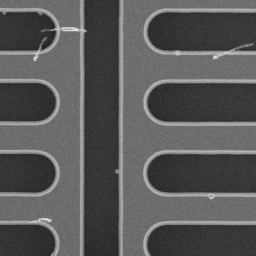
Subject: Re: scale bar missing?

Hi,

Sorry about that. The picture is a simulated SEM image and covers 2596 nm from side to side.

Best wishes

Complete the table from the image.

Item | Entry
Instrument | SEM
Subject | groups of lines, slits or small figures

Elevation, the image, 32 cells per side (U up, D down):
UUUUUUUUUUDDDDDUUUUUUUUUUUUUUUUU
DDDDDUUUUUDDDDDUUUUUDDDDDDDDDDDD
DDDDDDDUUUDDDDDUUUUDDDDDDDDDDDDD
DDDDDDDUUUDDDDDUUUDDDDDDDDDDDDDD
DDDDDDDUUUDDDDDUUUDDDDDDDDDDDDDD
DDDDDDDUUUDDDDDUUUUDDDDDDDDDDDDD
DDDDUUUUUUDDDDDUUUUUUDUDDDDDUDDD
UUUUUUUUUUDDDDDUUUUUUUUUUUUUUUUU
UUUUUUUUUUDDDDDUUUUUUUUUUUUUUUUU
UUUUUUUUUUDDDDDUUUUUUUUUUUUUUUUU
DDDDDDUUUUDDDDDUUUUUDDDDDDDDDDDD
DDDDDDDUUUDDDDDUUUUDDDDDDDDDDDDD
DDDDDDDUUUDDDDDUUUDDDDDDDDDDDDDD
DDDDDDDUUUDDDDDUUUDDDDDDDDDDDDDD
DDDDDDUUUUDDDDDUUUUDDDDDDDDDDDDD
UUUUUUUUUUDDDDDUUUUUUUUUUUUUUUUU
UUUUUUUUUUDDDDDUUUUUUUUUUUUUUUUU
UUUUUUUUUUDDDDDUUUUUUUUUUUUUUUUU
UUUUUUUUUUDDDDDUUUUUUUUUUUUUUUUU
DDDDDDUUUUDDDDDUUUUDDDDDDDDDDDDD
DDDDDDDUUUDDDDDUUUDDDDDDDDDDDDDD
DDDDDDDUUUDDDDDUUUDDDDDDDDDDDDDD
DDDDDDDUUUDDDDDUUUDDDDDDDDDDDDDD
DDDDDDUUUUDDDDDUUUUDDDDDDDDDDDDD
UUUUUUUUUUDDDDDUUUUUUUUUUUUUUUUU
UUUUUUUUUUDDDDDUUUUUUUUUUUUUUUUU
UUUUUUUUUUDDDDDUUUUUUUUUUUUUUUUU
UUUUUUUUUUDDDDDUUUUUUUUUUUUUUUUU
DDDDDDUUUUDDDDDUUUUDDDDDDDDDDDDD
DDDDDDDUUUDDDDDUUUDDDDDDDDDDDDDD
DDDDDDDUUUDDDDDUUUDDDDDDDDDDDDDD
DDDDDDDUUUDDDDDUUUDDDDDDDDDDDDDD